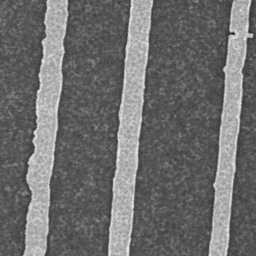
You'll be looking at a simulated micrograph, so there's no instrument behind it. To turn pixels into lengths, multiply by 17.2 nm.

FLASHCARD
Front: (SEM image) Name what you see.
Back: one or a few lines or trenches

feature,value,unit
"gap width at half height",71.4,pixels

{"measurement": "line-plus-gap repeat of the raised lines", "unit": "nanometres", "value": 1580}